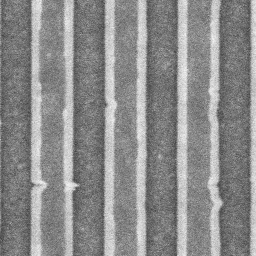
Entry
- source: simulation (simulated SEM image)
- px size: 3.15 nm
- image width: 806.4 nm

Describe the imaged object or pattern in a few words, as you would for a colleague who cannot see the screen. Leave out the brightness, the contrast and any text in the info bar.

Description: one or a few lines or trenches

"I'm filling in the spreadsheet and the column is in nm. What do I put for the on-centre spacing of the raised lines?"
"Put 231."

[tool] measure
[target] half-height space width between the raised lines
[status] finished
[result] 37.4 pixels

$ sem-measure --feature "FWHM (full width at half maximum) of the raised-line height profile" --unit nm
112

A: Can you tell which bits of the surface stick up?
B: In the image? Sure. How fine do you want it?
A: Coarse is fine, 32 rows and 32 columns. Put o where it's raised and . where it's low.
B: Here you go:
....ooooo.....oooo.....oooo.....
....ooooo.....oooo.....oooo.....
....ooooo.....oooo.....oooo.....
.....oooo.....oooo.....oooo.....
.....oooo.....oooo.....oooo.....
....ooooo.....oooo.....oooo.....
....ooooo.....oooo.....oooo.....
....ooooo.....oooo.....oooo.....
....ooooo.....oooo.....oooo.....
....ooooo.....oooo.....oooo.....
....ooooo.....oooo.....oooo.....
....ooooo.....oooo.....oooo.....
....ooooo.....oooo.....oooo.....
....ooooo.....oooo.....oooo.....
....ooooo.....oooo.....oooo.....
....ooooo.....oooo.....oooo.....
....ooooo.....oooo.....oooo.....
....ooooo.....oooo.....oooo.....
....ooooo.....oooo.....oooo.....
....ooooo.....oooo.....oooo.....
....ooooo.....oooo.....oooo.....
....ooooo.....oooo.....oooo.....
....ooooo.....oooo.....oooo.....
.....oooo.....oooo.....oooo.....
....ooooo.....oooo.....oooo.....
....ooooo.....oooo.....oooo.....
....ooooo....ooooo.....oooo.....
....ooooo....ooooo.....oooo.....
....ooooo.....oooo.....oooo.....
....ooooo.....oooo.....oooo.....
....ooooo.....oooo.....oooo.....
....ooooo.....oooo.....oooo.....